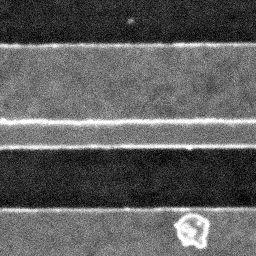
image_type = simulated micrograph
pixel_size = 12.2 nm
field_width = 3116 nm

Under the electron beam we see lines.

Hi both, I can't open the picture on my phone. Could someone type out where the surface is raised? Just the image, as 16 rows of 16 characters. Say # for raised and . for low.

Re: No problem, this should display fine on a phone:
................
................
................
################
################
################
################
################
################
................
................
................
................
################
################
################